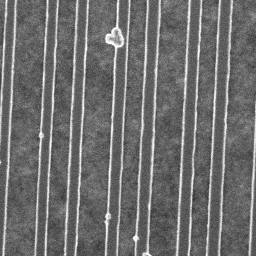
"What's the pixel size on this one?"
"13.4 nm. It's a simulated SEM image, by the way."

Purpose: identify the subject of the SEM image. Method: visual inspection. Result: parallel lines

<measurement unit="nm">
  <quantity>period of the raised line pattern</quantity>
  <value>470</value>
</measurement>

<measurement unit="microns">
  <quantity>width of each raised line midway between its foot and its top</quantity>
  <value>0.168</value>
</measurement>